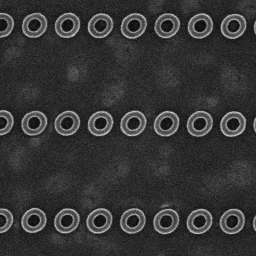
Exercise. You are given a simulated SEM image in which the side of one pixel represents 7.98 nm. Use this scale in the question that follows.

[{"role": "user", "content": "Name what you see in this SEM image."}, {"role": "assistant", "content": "a regular array of ring-shaped raised bodies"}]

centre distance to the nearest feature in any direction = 262 nanometers